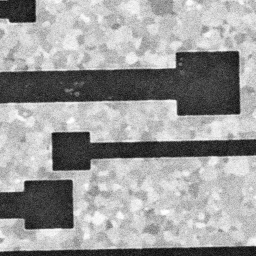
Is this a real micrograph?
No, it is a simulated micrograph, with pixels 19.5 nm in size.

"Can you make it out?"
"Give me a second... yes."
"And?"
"groups of lines, slits or small figures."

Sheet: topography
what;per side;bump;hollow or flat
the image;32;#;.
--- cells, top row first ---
.....###########################
.....###########################
#...############################
################################
################################
################################
######################........##
######################........##
################..............##
..............................##
..............................##
..............................##
..............................##
######################........##
#######################....#####
################################
#######....#####################
######.....#############........
######..........................
######..........................
######.....#####################
################################
####.....#######################
###......#######################
.........#######################
.........#######################
.........#######################
.##......#######################
###......#######################
################################
################################
................................